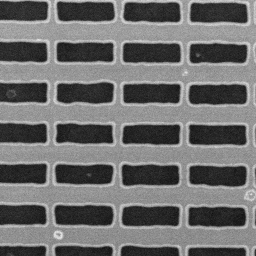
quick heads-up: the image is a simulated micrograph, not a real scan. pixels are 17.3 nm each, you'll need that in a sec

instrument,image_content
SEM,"groups of lines, slits or small figures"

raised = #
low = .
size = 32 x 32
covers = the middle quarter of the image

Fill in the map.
################################
################################
################################
################################
###.####....####################
.............#...............##.
.............#...............##.
.............#...............##.
.............#...............##.
............###..............##.
################################
################################
################################
################################
################################
............###..............##.
.............##..............##.
............##...............##.
.............#...............##.
.............#...............##.
######################.....#####
################################
################################
################################
################################
............##...............##.
.............#...............##.
.............#...............##.
............##...............##.
............##...............##.
########..#####.............####
################################